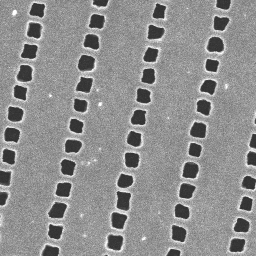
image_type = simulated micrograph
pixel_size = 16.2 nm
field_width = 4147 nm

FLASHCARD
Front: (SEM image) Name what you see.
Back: a regular array of holes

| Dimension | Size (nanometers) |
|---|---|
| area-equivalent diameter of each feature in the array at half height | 247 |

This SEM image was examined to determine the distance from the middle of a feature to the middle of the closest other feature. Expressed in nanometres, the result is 338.